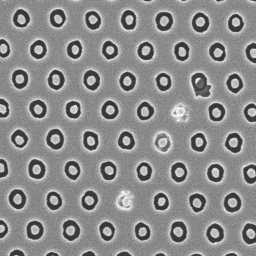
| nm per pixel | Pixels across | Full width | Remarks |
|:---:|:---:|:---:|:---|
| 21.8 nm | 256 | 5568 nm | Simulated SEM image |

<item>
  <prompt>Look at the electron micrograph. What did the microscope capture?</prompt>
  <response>a regular array of ring-shaped grooves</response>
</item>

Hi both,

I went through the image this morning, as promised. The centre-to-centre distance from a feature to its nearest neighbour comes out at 34.2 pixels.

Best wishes